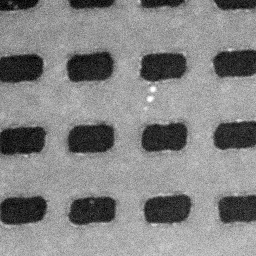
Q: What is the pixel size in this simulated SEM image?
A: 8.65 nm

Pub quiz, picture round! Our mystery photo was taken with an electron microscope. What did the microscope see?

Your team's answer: raised bodies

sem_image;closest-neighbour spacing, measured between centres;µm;0.619